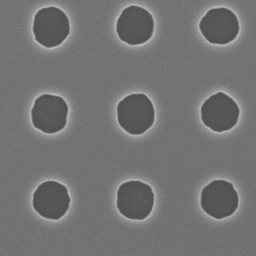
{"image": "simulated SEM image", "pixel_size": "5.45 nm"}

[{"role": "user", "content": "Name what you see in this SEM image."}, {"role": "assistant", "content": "a regular array of holes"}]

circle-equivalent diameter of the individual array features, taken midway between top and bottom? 211 nanometers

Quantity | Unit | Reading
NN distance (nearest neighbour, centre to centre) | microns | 0.46